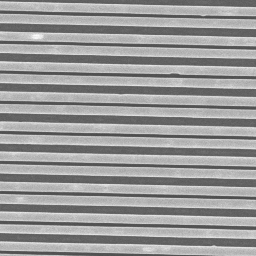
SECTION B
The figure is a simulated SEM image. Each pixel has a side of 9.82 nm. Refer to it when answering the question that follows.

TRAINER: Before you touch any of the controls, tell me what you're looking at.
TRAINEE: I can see parallel lines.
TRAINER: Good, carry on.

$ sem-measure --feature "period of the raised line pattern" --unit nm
147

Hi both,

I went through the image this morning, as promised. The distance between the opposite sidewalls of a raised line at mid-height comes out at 88.4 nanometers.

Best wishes